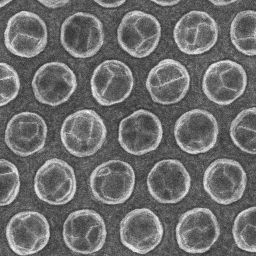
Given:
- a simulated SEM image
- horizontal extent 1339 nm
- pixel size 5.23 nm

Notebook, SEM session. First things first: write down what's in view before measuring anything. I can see a regular array of raised bodies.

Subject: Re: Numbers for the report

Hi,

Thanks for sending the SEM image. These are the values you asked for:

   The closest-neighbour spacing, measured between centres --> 294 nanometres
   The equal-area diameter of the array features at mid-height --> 217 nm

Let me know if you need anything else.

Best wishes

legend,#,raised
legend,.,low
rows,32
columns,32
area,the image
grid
#.....#......##............#....
................................
.####....###....###....###...###
.#####..#####..#####..#####..###
.#####..#####..#####..#####..###
.####...#####..####...#####..###
..###....###....###....##.....##
................................
#....###....####...####...####..
##..#####...####...####...#####.
##..#####...#####.######..#####.
##...####...####...####...####..
#....###....###.....##.....##...
................................
..###....###....###....###....##
.#####..#####..#####..#####..###
.#####..#####..#####..#####..###
.#####..#####..#####..#####..###
.####...####....###....###....##
................................
#.....##.....###....##.....##...
##...####...#####..####...####..
##..#####...#####.######..####..
##..#####...####...####...####..
##...####...####...####....###..
................................
..........#......##.....##....##
..####..#####...####...####...##
.#####..#####..#####..#####..###
.#####..#####..#####..#####..###
.#####..#####...####...####...##
..##......##.....#..............